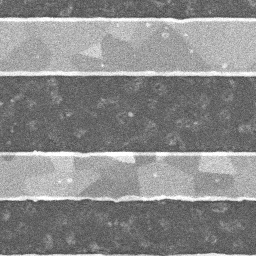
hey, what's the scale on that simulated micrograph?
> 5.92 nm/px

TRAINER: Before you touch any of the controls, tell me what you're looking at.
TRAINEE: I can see one or a few lines or trenches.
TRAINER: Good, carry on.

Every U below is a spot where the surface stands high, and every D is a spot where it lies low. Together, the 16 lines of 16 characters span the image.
DDDDDDDDDDDDDDDD
UUUUUUUUUUUUUUUU
UUUUUUUUUUUUUUUU
UUUUUUUUUUUUUUUU
UUUUUUUUUUUUUUUU
DDDDDDDDDDDDDDDD
DDDDDDDDDDDDDDDD
DDDDDDDDDDDDDDDD
DDDDDDDDDDDDDDDD
DDDDDDDDDDDDDDDD
UUUUUUUUUUUUUUUU
UUUUUUUUUUUUUUUU
DDDDDDDDDDDDDDDD
DDDDDDDDDDDDDDDD
DDDDDDDDDDDDDDDD
DDDDDDDDDDDDDDDD